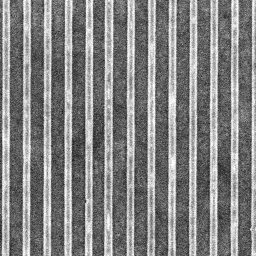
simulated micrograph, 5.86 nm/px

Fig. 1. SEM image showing parallel lines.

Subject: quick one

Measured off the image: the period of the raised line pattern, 0.122 µm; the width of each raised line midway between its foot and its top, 38.8 nanometers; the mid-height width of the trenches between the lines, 83.6 nanometers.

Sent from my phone